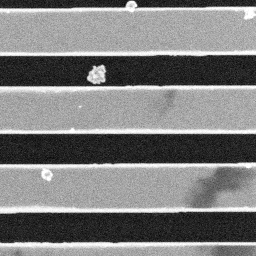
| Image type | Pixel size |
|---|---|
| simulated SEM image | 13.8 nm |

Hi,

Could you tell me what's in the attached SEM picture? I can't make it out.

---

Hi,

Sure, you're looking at lines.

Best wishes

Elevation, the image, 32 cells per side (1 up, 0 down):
00000000000000001000000000000000
11111111111111111111111111111111
11111111111111111111111111111111
11111111111111111111111111111111
11111111111111111111111111111111
11111111111111111111111111111111
11111111111111111111111111111111
00000000000000000000000000000000
00000000000000000000000000000000
00000000000000000000000000000000
00000000000000000000000000000000
11111111111111111111111111111111
11111111111111111111111111111111
11111111111111111111111111111111
11111111111111111111111111111111
11111111111111111111111111111111
11111111111111111111111111111111
00000000000000000000000000000000
00000000000000000000000000000000
00000000000000000000000000000000
00000000000000000000000000000000
11111111111111111111111111111111
11111111111111111111111111111111
11111111111111111111111111111111
11111111111111111111111111111111
11111111111111111111111111111111
00000000000000000000000000000000
00000000000000000000000000000000
00000000000000000000000000000000
00000000000000000000000000000000
11111111111111111111111111111111
11111111111111111111111111111111